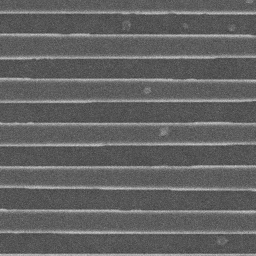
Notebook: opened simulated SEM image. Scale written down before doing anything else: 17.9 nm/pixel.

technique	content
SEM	lines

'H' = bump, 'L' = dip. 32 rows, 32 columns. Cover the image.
HHHHHHHHHHHHHHHHHHHHHHHHHHHHHHHH
HHHHHHHHHHHHHHHHHHHHHHHHHHHHHHHH
LLLLLLLLLLLLLLLLLLLLLLLLLLLLLLLL
LLLLLLLLLLLLLLLLLLLLLLLLLLLLLLLL
HHHHHHHHHHHHHHHHHHHHHHHHHHHHHHHH
HHHHHHHHHHHHHHHHHHHHHHHHHHHHHHHH
HHHHHHHHHHHHHHHHHHHHHHHHHHHHHHHH
LLLLLLLLLLLLLLLLLLLLLLLLLLLLLLLL
LLLLLLLLLLLLLLLLLLLLLLLLLLLLLLLL
LLLLLLLLLLLLLLLLLLLLLLLLLLLLLLLL
HHHHHHHHHHHHHHHHHHHHHHHHHHHHHHHH
HHHHHHHHHHHHHHHHHHHHHHHHHHHHHHHH
HHHHHHHHHHHHHHHHHHHHHHHHHHHHHHHH
LLLLLLLLLLLLLLLLLLLLLLLLLLLLLLLL
LLLLLLLLLLLLLLLLLLLLLLLLLLLLLLLL
HHHHHHHHHHHHHHHHHHHHHHHHHHHHHHHH
HHHHHHHHHHHHHHHHHHHHHHHHHHHHHHHH
HHHHHHHHHHHHHHHHHHHHHHHHHHHHHHHH
LLLLLLLLLLLLLLLLLLLLLLLLLLLLLLLL
LLLLLLLLLLLLLLLLLLLLLLLLLLLLLLLL
LLLLLLLLLLLLLLLLLLLLLLLLLLLLLLLL
HHHHHHHHHHHHHHHHHHHHHHHHHHHHHHHH
HHHHHHHHHHHHHHHHHHHHHHHHHHHHHHHH
LLLLLHHHHHHHHHHHHHHHHHHHHHHHHHHH
LLLLLLLLLLLLLLLLLLLLLLLLLLLLLLLL
LLLLLLLLLLLLLLLLLLLLLLLLLLLLLLLL
HHHHHHHHHHHHHHHHHHHHHHHHHHHHHHLL
HHHHHHHHHHHHHHHHHHHHHHHHHHHHHHHH
HHHHHHHHHHHHHHHHHHHHHHHHHHHHHHHH
LLLLLLLLLLLLLLLLLLLLLLLLLLLLLLLL
LLLLLLLLLLLLLLLLLLLLLLLLLLLLLLLL
LLLLLLLLLLLLLLLLLLLLLLLLLLLLLLLL